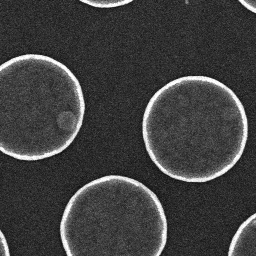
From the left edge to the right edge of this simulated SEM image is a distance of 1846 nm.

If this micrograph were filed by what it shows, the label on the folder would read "raised bodies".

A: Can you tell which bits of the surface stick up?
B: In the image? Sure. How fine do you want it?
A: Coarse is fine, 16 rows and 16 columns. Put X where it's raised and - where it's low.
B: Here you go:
----------------
----------------
----------------
----------------
XXXX------------
XXXXX-----XXXX--
XXXXX----XXXXXX-
XXXXX----XXXXXX-
XXXXX----XXXXXX-
XXXX-----XXXXXX-
----------XXXX--
------XXX-------
-----XXXXX------
----XXXXXX------
----XXXXXX-----X
----XXXXXX----XX